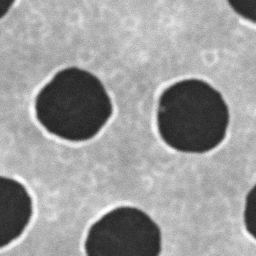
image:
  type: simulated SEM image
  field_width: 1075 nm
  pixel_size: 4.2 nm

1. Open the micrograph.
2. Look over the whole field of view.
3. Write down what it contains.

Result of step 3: holes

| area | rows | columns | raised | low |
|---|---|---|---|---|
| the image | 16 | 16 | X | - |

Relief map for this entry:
-XXXXXXXXXXXXXX-
XXXXXXXXXXXXXXXX
XXXXXXXXXXXXXXXX
XXXXXXXXXXXXXXXX
XXXX-XXXXXXXXXXX
XXX----XXXX--XXX
XX-----XXX----XX
XX-----XXX----XX
XXXX--XXXX----XX
XXXXXXXXXXXX-XXX
XXXXXXXXXXXXXXXX
-XXXXXXXXXXXXXXX
--XXXXXXXXXXXXX-
--XXXX---XXXXXX-
-XXXXX----XXXXXX
XXXXX-----XXXXXX